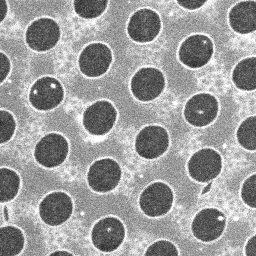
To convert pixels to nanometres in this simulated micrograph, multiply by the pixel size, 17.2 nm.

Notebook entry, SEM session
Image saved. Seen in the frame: a regular array of raised bodies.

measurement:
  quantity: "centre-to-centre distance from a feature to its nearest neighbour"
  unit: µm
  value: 0.994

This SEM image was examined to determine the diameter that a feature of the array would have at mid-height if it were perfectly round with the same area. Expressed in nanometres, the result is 630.